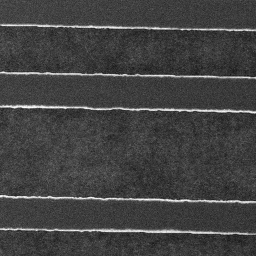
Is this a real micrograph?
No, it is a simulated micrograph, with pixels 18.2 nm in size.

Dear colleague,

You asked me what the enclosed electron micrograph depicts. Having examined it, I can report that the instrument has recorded lines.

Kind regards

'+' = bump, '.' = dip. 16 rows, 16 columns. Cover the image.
++++++++++++++++
++++++++++++++++
................
................
................
++++++++++++++++
++++++++++++++++
................
................
................
................
................
++++++++++......
++++++++++++++++
.........+++++++
................